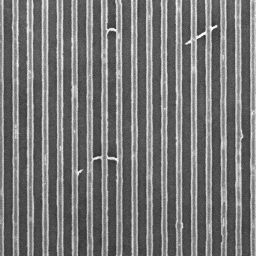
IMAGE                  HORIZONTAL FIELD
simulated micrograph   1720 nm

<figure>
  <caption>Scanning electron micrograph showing parallel lines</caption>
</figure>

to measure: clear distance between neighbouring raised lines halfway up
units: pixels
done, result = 9.51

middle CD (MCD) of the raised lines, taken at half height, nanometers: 31.9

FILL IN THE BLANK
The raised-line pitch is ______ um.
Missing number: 0.0999